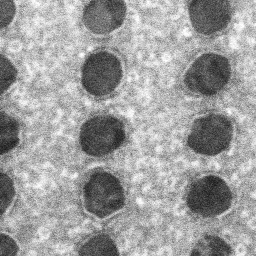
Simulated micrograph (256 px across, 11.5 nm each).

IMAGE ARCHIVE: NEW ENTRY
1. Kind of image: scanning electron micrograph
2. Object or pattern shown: raised bodies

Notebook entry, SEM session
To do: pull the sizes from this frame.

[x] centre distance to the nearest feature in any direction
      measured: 695 nm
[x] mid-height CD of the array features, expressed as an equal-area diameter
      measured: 538 nanometres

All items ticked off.